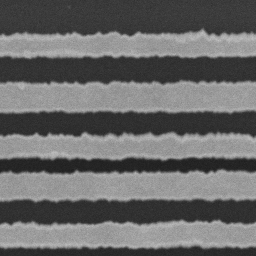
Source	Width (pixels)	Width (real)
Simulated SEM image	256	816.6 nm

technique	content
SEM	lines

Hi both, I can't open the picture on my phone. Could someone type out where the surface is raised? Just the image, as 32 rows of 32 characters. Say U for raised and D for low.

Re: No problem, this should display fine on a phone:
DDDDDDDDDDDDDDDDDDDDDDDDDDDDDDDD
DDDDDDDDDDDDDDDDDDDDDDDDDDDDDDDD
DDDDDDDDDDDDDDDDDDDDDDDDDDDDDDDD
DDDDDDDDDDDDDDDDDDDDDDDDDDDDDDDD
UUUUUUUUUUUUUUUUUUUUUUUUUUUUUUUU
UUUUUUUUUUUUUUUUUUUUUUUUUUUUUUUU
UUUUUUUUUUUUUUUUUUUUUUUUUUUUUUUU
DDDDDDDDDDDDDDDDDDDDDDDDDDDDDDDD
DDDDDDDDDDDDDDDDDDDDDDDDDDDDDDDD
DDDDDDDDDDDDDDDDDDDDDDDDDDDDDDDD
UUUUUUUUUUDUUUUUUUUUDUUUUUUUUUUU
UUUUUUUUUUUUUUUUUUUUUUUUUUUUUUUU
UUUUUUUUUUUUUUUUUUUUUUUUUUUUUUUU
UUUUUUUUUUUUUUUUUUUUUUUUUUUUUUUU
DDDDDDDDDDDDDDDDDDDDDDDDDDDDDDDD
DDDDDDDDDDDDDDDDDDDDDDDDDDDDDDDD
DDDDDDDDDDDDDDDDDDDDDDDDDDDDDDDD
UUUUUUUUUUUUUUUUUUUUUUUUUUUUUUUU
UUUUUUUUUUUUUUUUUUUUUUUUUUUUUUUU
UUUUUUUUUUUUUUUUUUUUUUUUUUUUUUUU
DDDDDDDDDDDDDDDDDDDDDDDDDDDDDDDD
DDDDDDDDDUDDDDDDDDDDDDDDUDDUUUUD
UUUUUUUUUUUUUUUUUUUUUUUUUUUUUUUU
UUUUUUUUUUUUUUUUUUUUUUUUUUUUUUUU
UUUUUUUUUUUUUUUUUUUUUUUUUUUUUUUU
DDDDDDDDDDDDDDDDDDDDDDDDDDDDDDDD
DDDDDDDDDDDDDDDDDDDDDDDDDDDDDDDD
DDDDDDDDDDDDDDDDDDDDDDDDDDDDDDDD
UUUUUUUUUUUUUUUUUUUUUUUUUUUUUUUU
UUUUUUUUUUUUUUUUUUUUUUUUUUUUUUUU
UUUUUUUUUUUUUUUUUUUUUUUUUUUUUUUU
DDDDDDDDDDDDDDDDDDDDDDDDDDDDDDDD